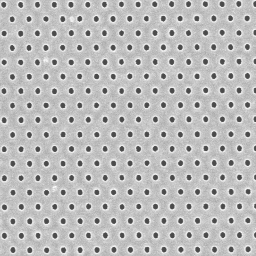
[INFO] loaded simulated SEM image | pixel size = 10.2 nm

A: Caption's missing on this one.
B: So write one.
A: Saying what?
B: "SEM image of a regular array of holes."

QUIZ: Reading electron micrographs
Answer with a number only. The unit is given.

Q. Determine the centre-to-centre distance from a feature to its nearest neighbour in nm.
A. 164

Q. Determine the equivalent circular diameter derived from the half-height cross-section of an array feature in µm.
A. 0.0551